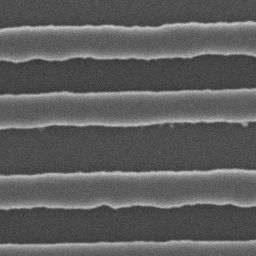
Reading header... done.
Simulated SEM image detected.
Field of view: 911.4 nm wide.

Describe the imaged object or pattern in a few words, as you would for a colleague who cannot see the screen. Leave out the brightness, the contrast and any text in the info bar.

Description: lines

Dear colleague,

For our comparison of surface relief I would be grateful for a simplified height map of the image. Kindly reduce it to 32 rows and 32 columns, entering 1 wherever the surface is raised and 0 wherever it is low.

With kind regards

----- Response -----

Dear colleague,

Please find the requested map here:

00000000000000000000000000000000
00000000000000000000000000000000
00000000000000000000000000000000
01111111111111111111111111111111
11111111111111111111111111111111
11111111111111111111111111111111
11111111111111111111111111111111
11110011000000000000000000000000
00000000000000000000000000000000
00000000000000000000000000000000
00000000000000000000000000000000
00000000000000011110111111111111
11111111111111111111111111111111
11111111111111111111111111111111
11111111111111111111111111111111
11111111111111111110000000000000
00000000000000000000000000000000
00000000000000000000000000000000
00000000000000000000000000000000
00000000000000000000000000000000
00000000000000000000000000000000
00000000000000000001111111111111
11111111111111111111111111111111
11111111111111111111111111111111
11111111111111111111111111111111
11111111111111111111111100010111
00000000000000000000000000000000
00000000000000000000000000000000
00000000000000000000000000000000
00000000000000000000000000000000
00000001111111111111111111111111
11111111111111111111111111111111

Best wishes